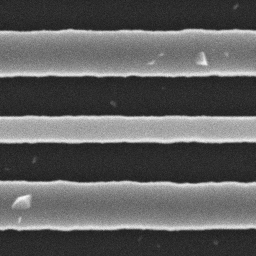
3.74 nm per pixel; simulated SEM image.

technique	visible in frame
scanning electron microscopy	lines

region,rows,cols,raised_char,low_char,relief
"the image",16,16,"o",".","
................
................
oooooooooooooooo
oooooooooooooooo
oooooooooooooooo
................
................
oooooooooooooooo
oooooooooooooooo
................
................
oooooooooooooooo
oooooooooooooooo
oooooooooooooooo
................
................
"